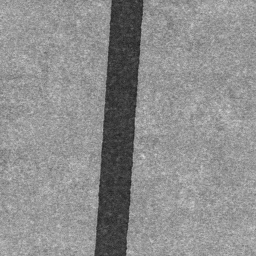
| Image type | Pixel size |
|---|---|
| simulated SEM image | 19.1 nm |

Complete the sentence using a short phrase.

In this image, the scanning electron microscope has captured one or a few lines or trenches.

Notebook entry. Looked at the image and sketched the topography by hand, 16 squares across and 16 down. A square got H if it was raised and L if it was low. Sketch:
HHHHHHHLLHHHHHHH
HHHHHHHLLHHHHHHH
HHHHHHHLLHHHHHHH
HHHHHHHLLHHHHHHH
HHHHHHHLLHHHHHHH
HHHHHHHLLHHHHHHH
HHHHHHHLLHHHHHHH
HHHHHHLLHHHHHHHH
HHHHHHLLHHHHHHHH
HHHHHHLLHHHHHHHH
HHHHHHLLHHHHHHHH
HHHHHHLLHHHHHHHH
HHHHHHLLHHHHHHHH
HHHHHHLLHHHHHHHH
HHHHHHLLHHHHHHHH
HHHHHHLLHHHHHHHH